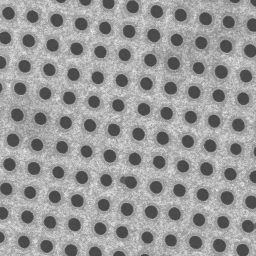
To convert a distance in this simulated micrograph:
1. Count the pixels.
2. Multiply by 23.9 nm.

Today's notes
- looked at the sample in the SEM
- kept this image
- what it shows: a regular array of holes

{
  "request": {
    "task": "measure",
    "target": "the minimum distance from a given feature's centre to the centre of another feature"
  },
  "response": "568 nm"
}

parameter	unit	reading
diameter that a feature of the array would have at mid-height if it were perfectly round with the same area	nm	303